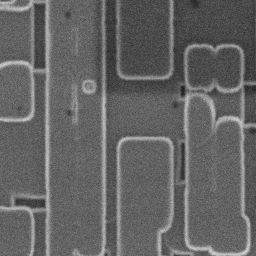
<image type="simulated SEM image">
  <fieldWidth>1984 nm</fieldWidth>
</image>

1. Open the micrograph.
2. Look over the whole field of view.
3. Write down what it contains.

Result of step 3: wiring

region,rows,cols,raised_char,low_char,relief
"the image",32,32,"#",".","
####..#######..#######..........
......#######..#######..........
......#######..#######..........
......#######..#######..........
......#######..#######..........
......#######..#######..........
......#######..#######.#######..
......#######..#######.#######..
####..#######..#######.#######..
####..#######..######..#######..
####..#######..........#######..
####..#######...........#.......
####..#######..........###......
####..#######..........####.....
####..#######..........####.....
......#######..........#######..
......#######..........#######..
......#######..######..#######..
......#######..#######.#######..
......#######..#######.#######..
......#######..#######.#######..
......#######..#######.#######..
......#######..#######.#######..
......#######..#######.#######..
......#######..#######.#######..
......#######..#######.#######..
####..#######..#######.########.
####..#######..######..########.
####..#######..######..########.
####..#######..#####...########.
####..#######..#####...########.
####..#######..#####......#####.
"